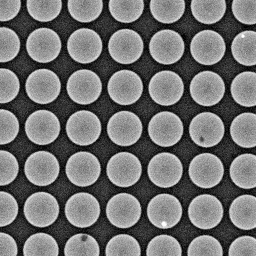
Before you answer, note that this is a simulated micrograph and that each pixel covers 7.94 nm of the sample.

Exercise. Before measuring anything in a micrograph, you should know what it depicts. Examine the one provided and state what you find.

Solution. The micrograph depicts an array of small figures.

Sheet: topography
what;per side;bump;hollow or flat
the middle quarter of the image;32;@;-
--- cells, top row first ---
--------------------------------
--------------------------------
--@@@@@@-----@@@@@-----@@@@@----
-@@@@@@@@---@@@@@@@---@@@@@@@---
-@@@@@@@@--@@@@@@@@--@@@@@@@@@--
-@@@@@@@@--@@@@@@@@@-@@@@@@@@@--
-@@@@@@@@--@@@@@@@@--@@@@@@@@@--
-@@@@@@@@--@@@@@@@@---@@@@@@@@--
--@@@@@@----@@@@@@@---@@@@@@@---
---@@@@------@@@@@-----@@@@@----
--------------------------------
--------------------------------
--@@@@@------@@@@------@@@@-----
-@@@@@@@----@@@@@@@---@@@@@@@---
-@@@@@@@@--@@@@@@@@---@@@@@@@---
-@@@@@@@@--@@@@@@@@--@@@@@@@@@--
-@@@@@@@@--@@@@@@@@--@@@@@@@@@-@
-@@@@@@@@--@@@@@@@@--@@@@@@@@@--
-@@@@@@@----@@@@@@@---@@@@@@@---
--@@@@@------@@@@@-----@@@@@----
--------------------------------
--------------------------------
---@@@@------@@@@-------@@@-----
--@@@@@@----@@@@@@----@@@@@@----
-@@@@@@@@--@@@@@@@@--@@@@@@@@---
-@@@@@@@@--@@@@@@@@--@@@@@@@@--@
-@@@@@@@@--@@@@@@@@--@@@@@@@@@-@
-@@@@@@@@--@@@@@@@@--@@@@@@@@--@
-@@@@@@@---@@@@@@@@---@@@@@@@---
--@@@@@@----@@@@@@----@@@@@@----
-----@--------@@--------@@@-----
--------------------------------